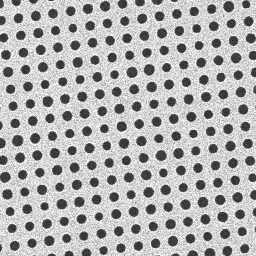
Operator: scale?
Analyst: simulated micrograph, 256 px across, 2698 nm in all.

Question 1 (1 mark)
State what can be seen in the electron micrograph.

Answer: a regular array of holes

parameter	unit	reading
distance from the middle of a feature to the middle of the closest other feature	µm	0.181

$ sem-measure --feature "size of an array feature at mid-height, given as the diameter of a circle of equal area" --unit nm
103